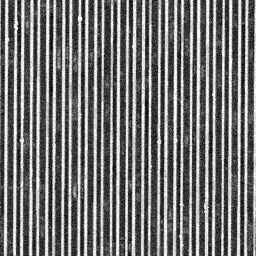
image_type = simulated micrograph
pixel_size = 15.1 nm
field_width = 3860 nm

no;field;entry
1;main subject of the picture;parallel lines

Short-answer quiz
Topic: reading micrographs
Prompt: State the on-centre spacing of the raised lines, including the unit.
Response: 120 nm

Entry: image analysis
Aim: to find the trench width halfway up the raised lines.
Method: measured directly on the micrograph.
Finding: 96.1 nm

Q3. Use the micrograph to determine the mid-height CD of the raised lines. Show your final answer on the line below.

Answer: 28.3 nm